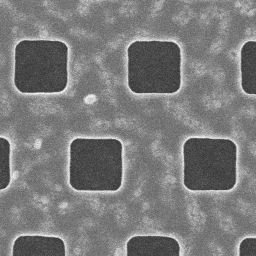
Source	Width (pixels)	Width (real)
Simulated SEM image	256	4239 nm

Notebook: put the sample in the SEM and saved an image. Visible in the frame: holes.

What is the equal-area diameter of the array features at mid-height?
967 nm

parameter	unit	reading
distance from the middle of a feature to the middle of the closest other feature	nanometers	1860